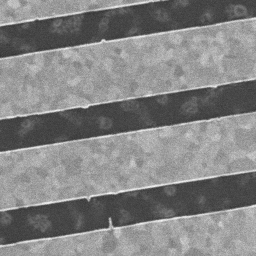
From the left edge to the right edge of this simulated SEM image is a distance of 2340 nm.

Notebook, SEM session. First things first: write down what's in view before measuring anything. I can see one or a few lines or trenches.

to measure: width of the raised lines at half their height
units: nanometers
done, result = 536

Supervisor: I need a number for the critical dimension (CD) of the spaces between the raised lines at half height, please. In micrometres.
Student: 0.308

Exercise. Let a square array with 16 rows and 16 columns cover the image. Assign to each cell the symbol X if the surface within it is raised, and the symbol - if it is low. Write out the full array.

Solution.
XXXXXXX---------
X-------------XX
-------XXXXXXXXX
-XXXXXXXXXXXXXXX
XXXXXXXXXXXXXXXX
XXXXXXXXXXXX----
XXXXXX----------
-------------XXX
-------XXXXXXXXX
XXXXXXXXXXXXXXXX
XXXXXXXXXXXXXXXX
XXXXXXXXXXX-----
XXXX------------
------------XXXX
------XXXXXXXXXX
XXXXXXXXXXXXXXXX